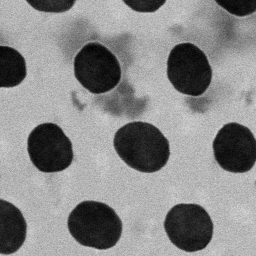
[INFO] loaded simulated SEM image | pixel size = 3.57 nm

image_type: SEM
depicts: holes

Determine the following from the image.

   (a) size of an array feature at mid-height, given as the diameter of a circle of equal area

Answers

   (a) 0.173 microns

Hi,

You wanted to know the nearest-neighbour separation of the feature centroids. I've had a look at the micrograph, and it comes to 321 nm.